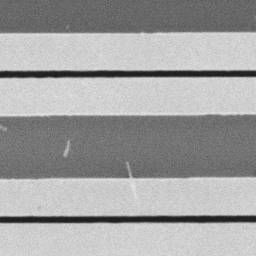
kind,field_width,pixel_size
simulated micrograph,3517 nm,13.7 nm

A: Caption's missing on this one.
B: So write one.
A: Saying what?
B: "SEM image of lines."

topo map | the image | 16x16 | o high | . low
................
................
oooooooooooooooo
oooooooooooooooo
oooooooooooooooo
oooooooooooooooo
oooooooooooooooo
................
................
................
................
oooooooooooooooo
oooooooooooooooo
oooooooooooooooo
oooooooooooooooo
oooooooooooooooo